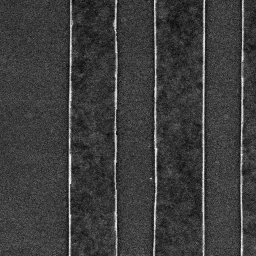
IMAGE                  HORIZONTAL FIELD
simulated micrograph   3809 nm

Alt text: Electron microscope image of one or a few lines or trenches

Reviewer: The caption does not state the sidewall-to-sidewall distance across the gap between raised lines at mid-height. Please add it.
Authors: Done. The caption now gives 575 nm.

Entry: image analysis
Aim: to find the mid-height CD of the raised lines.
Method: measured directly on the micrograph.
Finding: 705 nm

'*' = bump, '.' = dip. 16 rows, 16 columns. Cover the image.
....***...***..*
....***...***..*
....***...***..*
....***...***..*
....***...***..*
....***...***..*
....***...***..*
....***...***..*
....***...***..*
....***...***..*
....***...***..*
....***...***..*
....***...***..*
....***...***..*
....***...***..*
....***...***..*